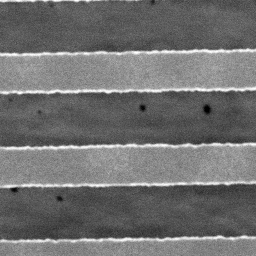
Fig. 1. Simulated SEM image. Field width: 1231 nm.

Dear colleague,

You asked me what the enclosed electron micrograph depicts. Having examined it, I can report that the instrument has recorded lines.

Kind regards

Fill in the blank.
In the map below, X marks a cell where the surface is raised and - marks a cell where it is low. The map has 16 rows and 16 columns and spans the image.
----------------
----------------
----------------
XXXXXXXXXXXXXXXX
XXXXXXXXXXXXXXXX
XXXXXXXXXXXXXXXX
----------------
----------------
----------------
XXXXXXXXXXXXXXXX
XXXXXXXXXXXXXXXX
XXXXXXXXXXX-----
----------------
----------------
----------------
XXXXXXXXXXXXXXXX